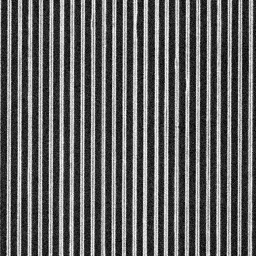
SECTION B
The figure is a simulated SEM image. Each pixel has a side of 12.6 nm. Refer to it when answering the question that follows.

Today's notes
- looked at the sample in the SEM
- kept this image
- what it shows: parallel lines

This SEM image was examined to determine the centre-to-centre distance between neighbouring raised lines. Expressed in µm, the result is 0.132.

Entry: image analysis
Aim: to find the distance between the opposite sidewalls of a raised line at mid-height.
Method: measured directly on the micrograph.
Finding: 0.033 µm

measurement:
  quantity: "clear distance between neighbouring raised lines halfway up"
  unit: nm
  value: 101